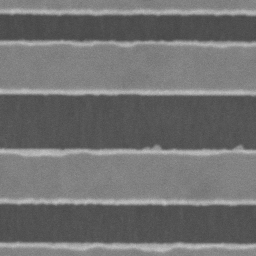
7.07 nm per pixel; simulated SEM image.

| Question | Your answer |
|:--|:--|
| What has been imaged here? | lines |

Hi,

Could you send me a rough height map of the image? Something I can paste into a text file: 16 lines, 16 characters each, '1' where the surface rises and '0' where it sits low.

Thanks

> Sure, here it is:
1111111111111111
0000000000000000
0000000000000000
1111111111111111
1111111111111111
1111111111111111
0000000000000000
0000000000000000
0000000000000000
1111111111111111
1111111111111111
1111111111111111
1111111111111111
0000000000000000
0000000000000000
1111111111111111